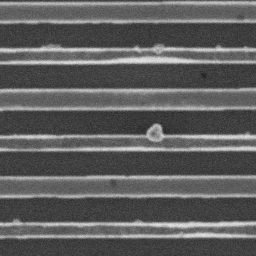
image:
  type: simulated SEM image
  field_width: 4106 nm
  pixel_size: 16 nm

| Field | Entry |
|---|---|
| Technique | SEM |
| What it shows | lines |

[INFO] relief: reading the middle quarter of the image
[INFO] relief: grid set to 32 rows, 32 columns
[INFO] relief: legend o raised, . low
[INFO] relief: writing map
................................
................................
................................
................................
................................
................................
oooooooooooooo......oooooooooooo
oooooooooooooooooooooooooooooooo
oooooooooooooooooooooooooooooooo
oooooooooooooooooooooooooooooooo
oooooooooooooooooooooooooooooooo
................................
................................
................................
................................
......................oo........
.....................ooo........
.....................oooo.......
oooooooooooooooooooooooooooooooo
oooooooooooooooooooooooooooooooo
oooooooooooooooooooooooooooooooo
................................
................................
................................
................................
................................
................................
................................
oooooooooooooooooooooooooooooooo
oooooooooooooooooooooooooooooooo
oooooooooooooooooooooooooooooooo
oooooooooooooooooooooooooooooooo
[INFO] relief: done